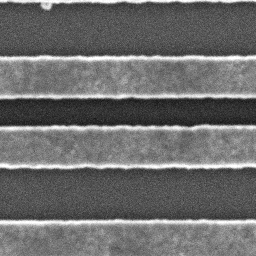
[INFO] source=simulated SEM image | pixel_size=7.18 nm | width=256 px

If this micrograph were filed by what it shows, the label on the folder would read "lines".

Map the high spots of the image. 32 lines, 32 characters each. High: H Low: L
LLLLLLLLLLLLLLLLLLLLLLLLLLLLLLLL
LLLLLLLLLLLLLLLLLLLLLLLLLLLLLLLL
LLLLLLLLLLLLLLLLLLLLLLLLLLLLLLLL
LLLLLLLLLLLLLLLLLLLLLLLLLLLLLLLL
LLLLLLLLLLLLLLLLLLLLLLLLLLLLLLLL
LLLLLLLLLLLLLLLLLLLLLLLLLLLLLLLL
LLLLLLLLLLLLLLLLLLLLLLLLLLLLLLLL
HHHHHHHHHHHHHHHHHHHHHHHHHHHHHHHH
HHHHHHHHHHHHHHHHHHHHHHHHHHHHHHHH
HHHHHHHHHHHHHHHHHHHHHHHHHHHHHHHH
HHHHHHHHHHHHHHHHHHHHHHHHHHHHHHHH
HHHHHHHHHHHHHHHHHHHHHHHHHHHHHHHH
LLLLLLLLLLLLLLLLLLLLLLLLLLLLLLLL
LLLLLLLLLLLLLLLLLLLLLLLLLLLLLLLL
LLLLLLLLLLLLLLLLLLLLLLLLLLLLLLLL
LLLLLLLLLLLLLLLLLLLLLLLLLLLLLLLL
HHHHHHHHHHHHHHHHHHHHHHHHHHHHHHHH
HHHHHHHHHHHHHHHHHHHHHHHHHHHHHHHH
HHHHHHHHHHHHHHHHHHHHHHHHHHHHHHHH
HHHHHHHHHHHHHHHHHHHHHHHHHHHHHHHH
HHHHHHHHHHHHHHHHHHHHHHHHHHHHHHHH
LLLLLLLLLLLLLLLLLLLLLLLLLLLLLLLL
LLLLLLLLLLLLLLLLLLLLLLLLLLLLLLLL
LLLLLLLLLLLLLLLLLLLLLLLLLLLLLLLL
LLLLLLLLLLLLLLLLLLLLLLLLLLLLLLLL
LLLLLLLLLLLLLLLLLLLLLLLLLLLLLLLL
LLLLLLLLLLLLLLLLLLLLLLLLLLLLLLLL
LLLLLLLLLLLLLLLLLLLLLLLLLLLLLLLL
HHHHHHHHHHHHHHHHHHHHHHHHHHHHHHHH
HHHHHHHHHHHHHHHHHHHHHHHHHHHHHHHH
HHHHHHHHHHHHHHHHHHHHHHHHHHHHHHHH
HHHHHHHHHHHHHHHHHHHHHHHHHHHHHHHH